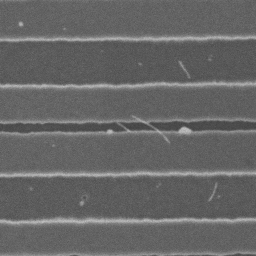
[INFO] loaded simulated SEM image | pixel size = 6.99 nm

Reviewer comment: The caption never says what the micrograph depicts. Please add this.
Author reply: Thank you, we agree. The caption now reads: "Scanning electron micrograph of lines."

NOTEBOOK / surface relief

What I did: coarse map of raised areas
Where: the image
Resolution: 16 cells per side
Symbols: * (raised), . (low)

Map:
****************
****************
................
................
................
****************
****************
****************
****************
****************
****************
................
................
................
****************
****************